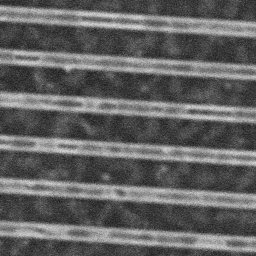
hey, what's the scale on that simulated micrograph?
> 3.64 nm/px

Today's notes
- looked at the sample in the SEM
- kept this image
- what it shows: parallel lines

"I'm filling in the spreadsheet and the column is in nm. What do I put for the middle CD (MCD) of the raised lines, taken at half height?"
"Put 43.6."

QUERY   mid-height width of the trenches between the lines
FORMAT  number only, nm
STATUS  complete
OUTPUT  112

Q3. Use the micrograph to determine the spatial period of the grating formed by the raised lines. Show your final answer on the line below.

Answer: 0.156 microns